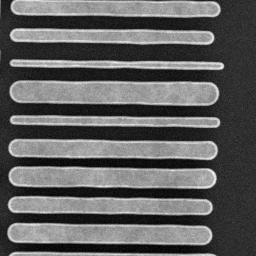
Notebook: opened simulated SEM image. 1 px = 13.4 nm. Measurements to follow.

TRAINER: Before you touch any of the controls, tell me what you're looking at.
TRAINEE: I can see groups of lines, slits or small figures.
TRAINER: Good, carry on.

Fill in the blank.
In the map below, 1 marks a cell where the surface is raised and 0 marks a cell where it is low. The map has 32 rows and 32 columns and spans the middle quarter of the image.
11111111111111111111111111111111
00000000000000000000000000000000
00000000000000000000000000000000
00000000000000000000000000000000
00000000000000000000000000000000
11111111111111111111111111111111
11111111111111111111111111111111
11111111111111111111111111111111
11111111111111111111111111111111
11111111111111111111111111111111
00000000000000000000000000000000
00000000000000000000000000000000
00000000000000000000000000000000
11111111111111110000000000000000
11111111111111111111111111111111
00000000000000000000000000000000
00000000000000000000000000000000
00000000000000000000000000000000
00000000000000000000000000000000
11111111111111111111111111100000
11111111111111111111111111111111
11111111111111111111111111111111
11111111111111111111111111111111
00000000000000000000000000000001
00000000000000000000000000000000
00000000000000000000000000000000
11111111111111111111111111111111
11111111111111111111111111111111
11111111111111111111111111111111
11111111111111111111111111111111
11111111111111111111111111111111
00000000000000000000000000000000